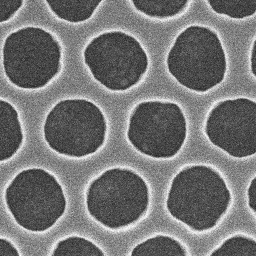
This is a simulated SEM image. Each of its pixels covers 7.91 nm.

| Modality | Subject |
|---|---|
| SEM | a regular array of holes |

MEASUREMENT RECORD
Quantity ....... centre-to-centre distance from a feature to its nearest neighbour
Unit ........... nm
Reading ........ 631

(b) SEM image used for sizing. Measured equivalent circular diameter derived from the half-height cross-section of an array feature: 477 nm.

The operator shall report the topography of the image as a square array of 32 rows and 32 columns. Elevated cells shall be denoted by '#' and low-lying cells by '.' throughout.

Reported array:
...###......#####......###......
..#####.....######.....####.....
.#######...#####################
###.###################...######
#.....######....######.....#####
#......####......#####......####
........###.......###.......####
.......####.......###.......###.
#......####.......###.......###.
#......#####......####......####
##....#######....######....#####
################################
########...#################...#
..#####.....#####......####.....
..####.......###.......###......
..####.......###.......###......
...###.......###.......###......
...###.......###.......###......
..####......#####......####.....
.########.#########...#######..#
################################
###...#######....######....#####
##.....#####......####......####
#.......###.......###.......###.
#.......###........##........##.
#.......###........##........##.
#.......###.......###.......####
##.....#####.....#####.....#####
###...########.#########..######
####################.########.##
.######.....#####......#####....
..#####......###.......####.....